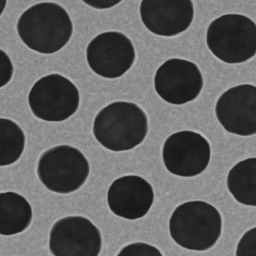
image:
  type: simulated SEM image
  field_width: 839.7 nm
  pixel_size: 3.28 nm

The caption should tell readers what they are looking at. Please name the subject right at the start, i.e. a regular array of holes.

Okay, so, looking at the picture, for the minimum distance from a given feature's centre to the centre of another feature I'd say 233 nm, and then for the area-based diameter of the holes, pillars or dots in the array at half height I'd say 157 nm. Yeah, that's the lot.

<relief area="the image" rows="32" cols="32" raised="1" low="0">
01111001111000011100000011111111
11100000111111111100000011111111
11000000011111111100000011100001
11000000011111111110000111000000
11000000011100001111111111000000
11100000111000001111111111000000
11111001111000000111111111100000
01111111111000000111100111110001
01111111111000001111000001111111
01111100111110011110000001111111
01110000011111111110000001111111
11110000001111111111000001110000
11110000001111111111100011100000
11110000001110000111111111100000
11111000011100000011111111100000
00111111111100000011111111110000
00011111111100000011110011111000
00011111111100000011100000111111
00011110011110001111100000111111
00111000001111111111000000111111
01111000000111111111100000111100
11111000000111111111100001111000
11111000000111100011111111111000
11111100001111000001111111111000
00011111111110000001111111111000
00001111111111000001111000111110
00001111111111000011110000011111
00001111000111111111100000001111
00011110000011111111100000001111
11111100000001111111100000011100
11111100000001110011110000011100
11111110000011100000111111111100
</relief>